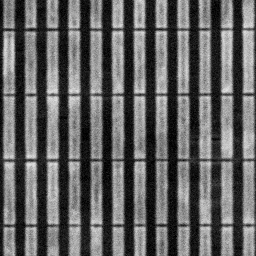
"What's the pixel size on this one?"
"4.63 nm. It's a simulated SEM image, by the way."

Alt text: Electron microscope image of wiring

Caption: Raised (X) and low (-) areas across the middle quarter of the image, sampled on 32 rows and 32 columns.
-XXX---XX---XXX---XX---XX----XX-
-XXX---XX---XXX---XX---XX----XX-
-XXX---XX---XXX---XX---XX----XX-
-XXX---XX---XXX---XX---XX----XX-
-XXX---XX---XXX---XX---XX----XX-
-XXX---XX---XXX---XX---XX----XX-
-XXX---XX---XXX---XX---XXX---XX-
--------------------------------
-XXX---XX---XXX---XX---XX----XX-
-XXX---XX---XXX---XX---XX----XX-
-XXX---XX---XXX---XX---XX----XX-
-XXX---XX---XXX---XX---XXX---XX-
-XXX---XX---XXX---XX---XXX---XX-
-XXX---XX---XXX---XX---XXX---XX-
-XXX---XX---XXX---XX---XXX---XX-
-XXX---XX---XXX---XX---XXX---XX-
-XXX---XX---XXX---XX---XXX---XX-
-XXX---XX---XXX---XX---XXX---XX-
-XXX---XX---XXX---XX---XXX---XX-
-XXX---XX---XXX---XX---XXX---XX-
-XXX---XX---XXX---XX---XXX---XX-
-XXX---XX---XXX---XX---XXX---XX-
-XXX---XX---XXX---XX---XXX---XX-
-XXX---XX---XXX---X----XXX----X-
-XX----XX---XXX---XX---XXX---XX-
-XXX---XX---XXX---XX---XXX---XX-
-XXX---XX---XXX---XX---XXX---XX-
--XX---XX---XXX---XX---XXX---XX-
--XX---XX---XXX---XX---XXX---XX-
-XXX---XX---XXX---XX---XXX---XX-
-XXX---XX---XXX---XX---XXX---XX-
-XXX---XX---XXX---XX---XXX---XX-